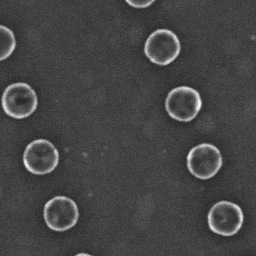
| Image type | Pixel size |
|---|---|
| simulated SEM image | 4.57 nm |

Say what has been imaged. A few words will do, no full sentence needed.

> raised bodies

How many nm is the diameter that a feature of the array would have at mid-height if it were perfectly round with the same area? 152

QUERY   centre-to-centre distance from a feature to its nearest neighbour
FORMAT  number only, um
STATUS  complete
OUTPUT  0.277